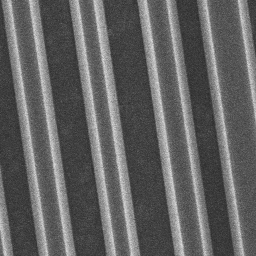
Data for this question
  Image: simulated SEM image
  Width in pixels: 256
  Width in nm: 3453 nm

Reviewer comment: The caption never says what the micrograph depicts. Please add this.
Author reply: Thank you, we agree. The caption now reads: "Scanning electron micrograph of one or a few lines or trenches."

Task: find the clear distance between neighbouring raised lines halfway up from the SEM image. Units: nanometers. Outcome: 522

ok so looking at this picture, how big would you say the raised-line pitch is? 908 nanometres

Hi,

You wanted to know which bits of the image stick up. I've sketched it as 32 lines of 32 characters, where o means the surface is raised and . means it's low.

.ooo.....ooo......ooo....ooooo..
.ooo.....ooo......oooo...oooooo.
.oooo....oooo.....oooo....ooooo.
.oooo.....ooo.....oooo....ooooo.
.oooo.....ooo.....oooo....ooooo.
..ooo.....ooo......ooo....ooooo.
..ooo.....ooo......ooo....ooooo.
..ooo.....ooo......ooo....ooooo.
..ooo.....oooo.....oooo...oooooo
..oooo.....ooo.....oooo....ooooo
..oooo.....ooo.....oooo....ooooo
..oooo.....ooo.....oooo....ooooo
...ooo.....ooo......ooo....ooooo
...ooo.....ooo......ooo....ooooo
...ooo.....ooo......oooo...ooooo
...oooo.....ooo.....oooo...ooooo
...oooo.....ooo.....oooo....oooo
...oooo.....ooo.....oooo....oooo
...oooo.....ooo.....oooo....oooo
....ooo.....ooo......ooo....oooo
....ooo.....ooo......ooo....oooo
....ooo.....ooo......oooo...oooo
....oooo.....ooo.....oooo...oooo
....oooo.....ooo.....oooo....ooo
....oooo.....ooo.....oooo....ooo
.....ooo.....ooo.....oooo....ooo
.....ooo.....ooo......ooo....ooo
.....ooo.....ooo......ooo....ooo
o....ooo.....ooo......oooo...ooo
o....oooo....oooo.....oooo....oo
o....oooo.....ooo.....oooo....oo
o....oooo.....ooo.....oooo....oo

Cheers